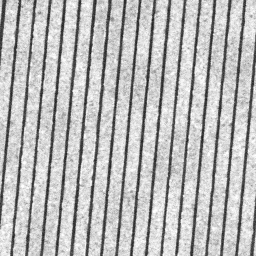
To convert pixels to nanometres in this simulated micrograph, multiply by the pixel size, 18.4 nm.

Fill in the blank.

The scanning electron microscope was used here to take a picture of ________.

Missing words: parallel lines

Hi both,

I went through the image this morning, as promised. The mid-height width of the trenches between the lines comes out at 59.5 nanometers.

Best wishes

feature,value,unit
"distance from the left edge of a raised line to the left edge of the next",14.9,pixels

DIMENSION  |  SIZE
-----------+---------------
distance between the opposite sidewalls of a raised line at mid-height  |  213 nm